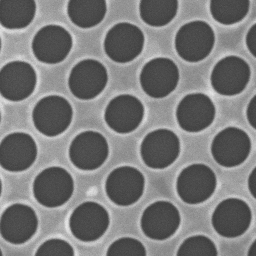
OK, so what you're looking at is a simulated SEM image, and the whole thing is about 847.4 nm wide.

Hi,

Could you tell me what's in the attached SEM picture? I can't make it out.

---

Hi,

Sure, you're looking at a regular array of holes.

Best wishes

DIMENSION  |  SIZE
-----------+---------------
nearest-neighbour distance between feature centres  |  0.165 micrometres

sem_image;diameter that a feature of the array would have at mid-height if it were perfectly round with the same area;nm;135